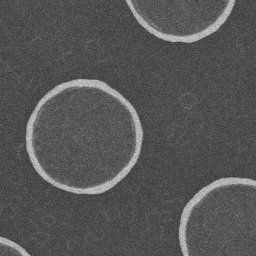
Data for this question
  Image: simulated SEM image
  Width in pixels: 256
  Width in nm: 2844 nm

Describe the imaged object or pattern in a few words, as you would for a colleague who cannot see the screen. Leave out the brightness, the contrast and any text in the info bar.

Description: raised bodies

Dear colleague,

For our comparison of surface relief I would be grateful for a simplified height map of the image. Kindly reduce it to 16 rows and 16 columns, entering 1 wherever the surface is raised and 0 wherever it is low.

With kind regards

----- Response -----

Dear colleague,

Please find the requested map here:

0000000011111100
0000000001111100
0000000000000000
0000000000000000
0000000000000000
0000111000000000
0001111100000000
0011111110000000
0011111110000000
0011111110000000
0011111100000000
0000111000000011
0000000000001111
0000000000001111
0000000000011111
1000000000011111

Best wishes